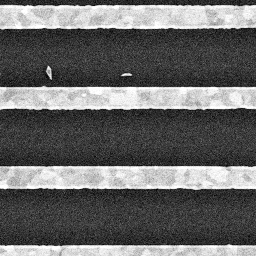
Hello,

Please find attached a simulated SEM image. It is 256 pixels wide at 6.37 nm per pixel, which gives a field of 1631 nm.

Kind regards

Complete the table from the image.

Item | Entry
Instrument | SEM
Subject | lines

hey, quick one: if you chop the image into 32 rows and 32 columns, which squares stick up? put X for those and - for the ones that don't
--------------------------------
XXXXXXXXXXXXXXXXXXXXXXXXXXXXXXXX
XXXXXXXXXXXXXXXXXXXXXXXXXXXXXXXX
XXXXXXXXXXXXXXXXXXXXXXXXXXXXXX--
--------------------------------
--------------------------------
--------------------------------
--------------------------------
--------------------------------
--------------------------------
--------------------------------
XXXXXXXXXXXXXXXXXXXXXXXXXXXXXXXX
XXXXXXXXXXXXXXXXXXXXXXXXXXXXXXXX
XXXXXXXXXXXXXXXXXXXXXXXXXXXXXXXX
--------------------------------
--------------------------------
--------------------------------
--------------------------------
--------------------------------
--------------------------------
--------------------------------
XXXXXXXXXXXXXXXXXXXXXXXXXXXXXXXX
XXXXXXXXXXXXXXXXXXXXXXXXXXXXXXXX
XXXXXXXXXXXXXXXXXXXXXX-XXXXXXXXX
--------------------------------
--------------------------------
--------------------------------
--------------------------------
--------------------------------
--------------------------------
--------------------------------
XXXXXXXXXXXXXXXXXXXXXXXXXXXXXXXX